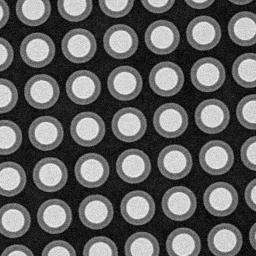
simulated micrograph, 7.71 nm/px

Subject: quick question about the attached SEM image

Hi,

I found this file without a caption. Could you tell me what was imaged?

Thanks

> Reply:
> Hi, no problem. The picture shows an array of small figures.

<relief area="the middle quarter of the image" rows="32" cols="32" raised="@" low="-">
-----------------------@@@@@@---
------------@@@@@@----@@@@@@@---
--@@@@@@----@@@@@@@--@@@@@@@@@--
-@@@@@@@---@@@@@@@@--@@@@@@@@@--
-@@@@@@@@--@@@@@@@@@-@@@@@@@@@--
-@@@@@@@@--@@@@@@@@---@@@@@@@@--
-@@@@@@@@--@@@@@@@@---@@@@@@@---
-@@@@@@@@---@@@@@@@----@@@@@----
-@@@@@@@-----@@@@@--------------
---@@@@-------------------------
------------------------@@@@@---
--------------@@@@@----@@@@@@@--
----@@@@-----@@@@@@@---@@@@@@@@-
--@@@@@@@---@@@@@@@@--@@@@@@@@@-
--@@@@@@@@--@@@@@@@@@-@@@@@@@@@-
--@@@@@@@@--@@@@@@@@@--@@@@@@@@-
--@@@@@@@@--@@@@@@@@---@@@@@@@--
--@@@@@@@@---@@@@@@@----@@@@@---
--@@@@@@@@---@@@@@@-------------
---@@@@@@-----------------------
-----@@-------------------@@@---
----------------@@@------@@@@@@-
------@@------@@@@@@----@@@@@@@@
----@@@@@@----@@@@@@@--@@@@@@@@@
---@@@@@@@@--@@@@@@@@@-@@@@@@@@@
---@@@@@@@@--@@@@@@@@@-@@@@@@@@@
@--@@@@@@@@--@@@@@@@@@--@@@@@@@@
@--@@@@@@@@--@@@@@@@@----@@@@@@-
@--@@@@@@@@---@@@@@@@-----@@@@--
@---@@@@@@------@@@-------------
-----@@@@-----------------------
--------------------------@@@@@@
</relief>